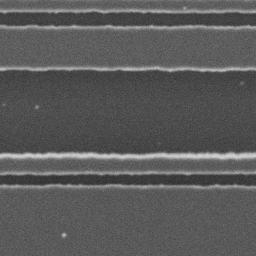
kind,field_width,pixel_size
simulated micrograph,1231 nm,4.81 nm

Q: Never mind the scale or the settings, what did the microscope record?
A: lines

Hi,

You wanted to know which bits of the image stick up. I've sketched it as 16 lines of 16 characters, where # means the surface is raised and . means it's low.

################
################
################
################
................
................
................
................
................
................
################
################
################
################
################
################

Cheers